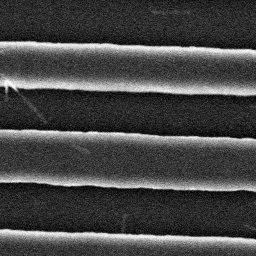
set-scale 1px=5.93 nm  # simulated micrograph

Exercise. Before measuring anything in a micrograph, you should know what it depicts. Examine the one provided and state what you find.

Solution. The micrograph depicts lines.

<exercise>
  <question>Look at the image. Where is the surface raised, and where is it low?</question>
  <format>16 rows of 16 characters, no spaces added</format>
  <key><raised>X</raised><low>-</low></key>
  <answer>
----------------
----------------
----------------
XXXXXXXXXXXXXXXX
XXXXXXXXXXXXXXXX
----XXXXXXXXXXXX
----------------
----------------
XXXXXXXXXX------
XXXXXXXXXXXXXXXX
XXXXXXXXXXXXXXXX
---XXXXXXXXXXXXX
----------------
----------------
XX--------------
XXXXXXXXXXXXXXXX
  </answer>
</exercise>